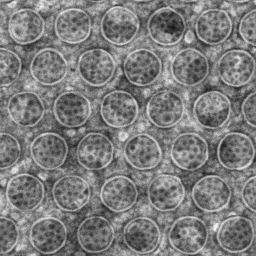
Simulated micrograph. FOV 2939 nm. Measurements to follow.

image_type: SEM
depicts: a regular array of raised bodies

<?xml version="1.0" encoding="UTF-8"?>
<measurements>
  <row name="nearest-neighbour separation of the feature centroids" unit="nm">533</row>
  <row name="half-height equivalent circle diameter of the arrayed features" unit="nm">412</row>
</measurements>